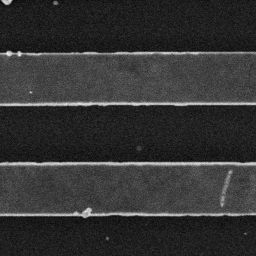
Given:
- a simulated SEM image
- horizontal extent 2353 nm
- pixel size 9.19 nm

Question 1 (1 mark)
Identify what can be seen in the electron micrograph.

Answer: lines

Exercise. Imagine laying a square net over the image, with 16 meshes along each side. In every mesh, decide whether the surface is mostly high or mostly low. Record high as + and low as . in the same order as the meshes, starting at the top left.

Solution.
................
................
................
++++++++++++++++
++++++++++++++++
++++++++++++++++
++++++++++++++++
................
................
................
++++++++++++++++
++++++++++++++++
++++++++++++++++
.....+..........
................
................